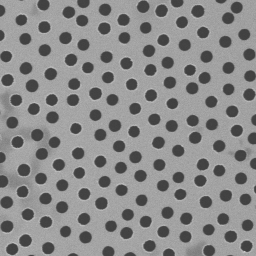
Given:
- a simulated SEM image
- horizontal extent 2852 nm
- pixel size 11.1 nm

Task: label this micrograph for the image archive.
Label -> a regular array of holes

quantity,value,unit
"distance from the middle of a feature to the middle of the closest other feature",0.216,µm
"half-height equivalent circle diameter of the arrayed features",134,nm